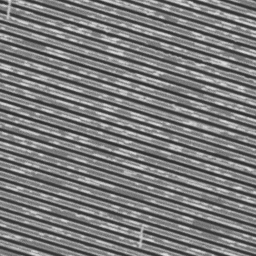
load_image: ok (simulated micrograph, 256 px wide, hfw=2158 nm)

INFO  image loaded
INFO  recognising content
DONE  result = parallel lines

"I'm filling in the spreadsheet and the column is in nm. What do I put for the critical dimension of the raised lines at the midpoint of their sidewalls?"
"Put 49.4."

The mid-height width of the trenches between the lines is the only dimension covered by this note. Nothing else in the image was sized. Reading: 25.2 nanometres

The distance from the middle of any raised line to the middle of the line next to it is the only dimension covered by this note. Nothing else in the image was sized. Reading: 79.4 nm